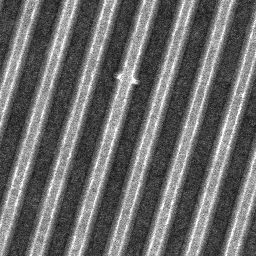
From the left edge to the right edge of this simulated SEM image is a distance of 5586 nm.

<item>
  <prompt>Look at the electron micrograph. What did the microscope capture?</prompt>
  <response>parallel lines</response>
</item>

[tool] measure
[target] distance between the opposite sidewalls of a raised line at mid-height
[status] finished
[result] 345 nm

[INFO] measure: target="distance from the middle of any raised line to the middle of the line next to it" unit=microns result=0.817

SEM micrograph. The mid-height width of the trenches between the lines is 476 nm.